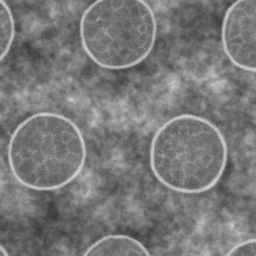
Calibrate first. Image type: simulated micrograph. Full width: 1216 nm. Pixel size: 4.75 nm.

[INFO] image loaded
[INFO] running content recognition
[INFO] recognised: raised bodies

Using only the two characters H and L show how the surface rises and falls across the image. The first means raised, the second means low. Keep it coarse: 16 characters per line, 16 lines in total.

LLLLLLHHHLLLLLLH
HLLLLHHHHHLLLLHH
HLLLLHHHHHLLLLHH
LLLLLLHHHLLLLLHH
LLLLLLLLLLLLLLLL
LLLLLLLLLLLLLLLL
LLLLLLLLLLLLLLLL
LLHHLLLLLLLHHLLL
LHHHHLLLLLHHHHLL
LHHHHLLLLLHHHHLL
LHHHHLLLLLHHHHLL
LLHHLLLLLLHHHLLL
LLLLLLLLLLLLLLLL
LLLLLLLLLLLLLLLL
LLLLLLLLLLLLLLLL
LLLLLLHHHLLLLLLH